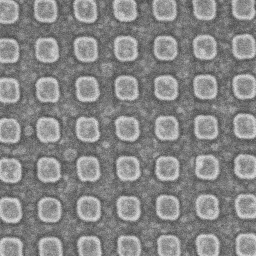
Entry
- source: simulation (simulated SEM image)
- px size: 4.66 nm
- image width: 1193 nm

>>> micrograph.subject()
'a regular array of raised bodies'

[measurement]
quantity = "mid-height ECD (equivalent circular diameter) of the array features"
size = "109 nm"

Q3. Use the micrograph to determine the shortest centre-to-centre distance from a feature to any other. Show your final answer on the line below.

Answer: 0.183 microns